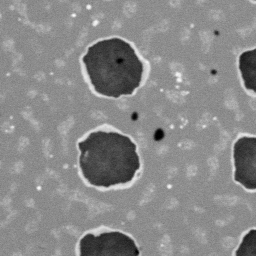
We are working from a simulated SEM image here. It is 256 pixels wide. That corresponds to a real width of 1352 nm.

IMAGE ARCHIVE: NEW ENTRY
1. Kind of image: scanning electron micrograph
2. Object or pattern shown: holes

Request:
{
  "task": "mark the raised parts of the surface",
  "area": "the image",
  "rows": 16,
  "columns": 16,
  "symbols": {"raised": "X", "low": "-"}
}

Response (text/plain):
XXXXXXXXXXXXXXXX
XXXXXXXXXXXXXXXX
XXXXXX--XXXXXXXX
XXXXX----XXXXXX-
XXXXX----XXXXXX-
XXXXXX---XXXXXX-
XXXXXXXXXXXXXXXX
XXXXXXXXXXXXXXXX
XXXXX---XXXXXXXX
XXXXX----XXXXXX-
XXXXX----XXXXXX-
XXXXXX--XXXXXXX-
XXXXXXXXXXXXXXXX
XXXXXXXXXXXXXXXX
XXXXXX-XXXXXXXXX
XXXXX----XXXXXX-